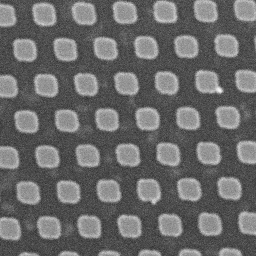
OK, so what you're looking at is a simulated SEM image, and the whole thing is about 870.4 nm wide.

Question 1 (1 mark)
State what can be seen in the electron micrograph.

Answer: a regular array of raised bodies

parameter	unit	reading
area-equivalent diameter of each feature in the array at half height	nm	77.7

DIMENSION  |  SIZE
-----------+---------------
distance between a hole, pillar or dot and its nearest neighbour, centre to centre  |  137 nanometers